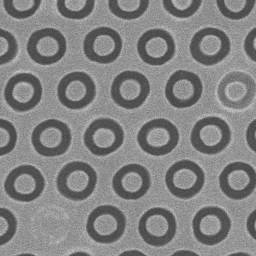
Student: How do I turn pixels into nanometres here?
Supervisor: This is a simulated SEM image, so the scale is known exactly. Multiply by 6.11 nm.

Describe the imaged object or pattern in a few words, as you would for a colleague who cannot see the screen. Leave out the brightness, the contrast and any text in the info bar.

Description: a regular array of ring-shaped grooves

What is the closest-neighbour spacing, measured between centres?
304 nanometers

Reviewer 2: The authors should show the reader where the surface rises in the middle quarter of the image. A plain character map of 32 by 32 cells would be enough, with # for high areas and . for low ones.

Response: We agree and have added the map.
######################..########
#############################..#
#.....########......#######.....
.......######........#####......
..##...#####...####..#####..###.
.####...####..#####..####..#####
.####...####..#####..####..#####
.####...####..#####..####..#####
.###...#####...###...#####..####
.......######.......######......
......########.....########.....
################.###############
################################
#########...####################
#######......########......#####
.#####........######........####
..####..###....####...####...###
..###..#####...###...#####...###
..###..######..###...#####...###
..###..#####...###...#####..####
.####...####..#####...##....####
.#####.......#######.......#####
#######....##########.....######
################################
##...#######################....
.......########.....#######.....
........######.......#####...###
..####..#####...##...####...####
.#####..####...####...###..#####
.#####..####...####...###..#####
.#####..####...####...####..####
..###..#####...###...#####......